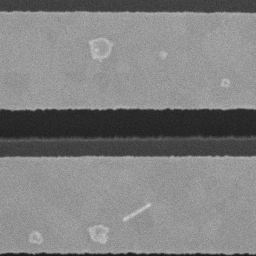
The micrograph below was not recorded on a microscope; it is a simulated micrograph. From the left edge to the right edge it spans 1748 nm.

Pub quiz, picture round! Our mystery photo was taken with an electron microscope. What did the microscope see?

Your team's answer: lines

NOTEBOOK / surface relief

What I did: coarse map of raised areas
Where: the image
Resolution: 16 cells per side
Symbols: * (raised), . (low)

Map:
................
****************
****************
****************
****************
****************
****************
................
................
................
****************
****************
****************
****************
****************
****************